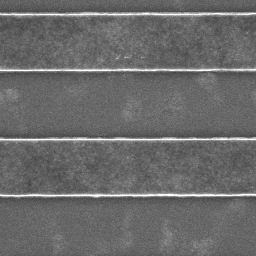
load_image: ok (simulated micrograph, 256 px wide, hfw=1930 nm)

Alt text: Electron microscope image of one or a few lines or trenches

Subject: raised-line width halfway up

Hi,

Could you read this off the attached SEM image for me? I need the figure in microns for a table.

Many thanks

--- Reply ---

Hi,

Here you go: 0.421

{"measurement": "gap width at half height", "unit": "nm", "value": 520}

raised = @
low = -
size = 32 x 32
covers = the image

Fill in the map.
--------------------------------
--------------------------------
@@@@@@@@@@@@@@@@@@@@@@@@@@@@@@@@
@@@@@@@@@@@@@@@@@@@@@@@@@@@@@@@@
@@@@@@@@@@@@@@@@@@@@@@@@@@@@@@@@
@@@@@@@@@@@@@@@@@@@@@@@@@@@@@@@@
@@@@@@@@@@@@@@@@@@@@@@@@@@@@@@@@
@@@@@@@@@@@@@@@@@@@@@@@@@@@@@@@@
@@@@@@@@@@@@@@@@@@@@@@@@@@@@@@@@
--------------------------------
--------------------------------
--------------------------------
--------------------------------
--------------------------------
--------------------------------
--------------------------------
--------------------------------
@@@@-@@@@@@@@@@@@@@@@@@@@@@@@@@@
@@@@@@@@@@@@@@@@@@@@@@@@@@@@@@@@
@@@@@@@@@@@@@@@@@@@@@@@@@@@@@@@@
@@@@@@@@@@@@@@@@@@@@@@@@@@@@@@@@
@@@@@@@@@@@@@@@@@@@@@@@@@@@@@@@@
@@@@@@@@@@@@@@@@@@@@@@@@@@@@@@@@
@@@@@@@@@@@@@@@@@@@@@@@@@@@@@@@@
--------------------------------
--------------------------------
--------------------------------
--------------------------------
--------------------------------
--------------------------------
--------------------------------
--------------------------------